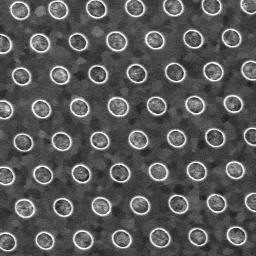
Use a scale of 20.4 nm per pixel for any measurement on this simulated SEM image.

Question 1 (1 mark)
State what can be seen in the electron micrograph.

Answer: a regular array of holes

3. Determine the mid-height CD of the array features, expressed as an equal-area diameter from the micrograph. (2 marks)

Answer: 0.344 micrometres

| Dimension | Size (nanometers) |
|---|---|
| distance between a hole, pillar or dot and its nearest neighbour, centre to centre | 773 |